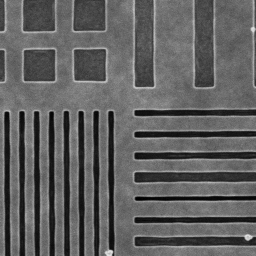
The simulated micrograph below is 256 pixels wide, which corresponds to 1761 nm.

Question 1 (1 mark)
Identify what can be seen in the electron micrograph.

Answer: groups of lines, slits or small figures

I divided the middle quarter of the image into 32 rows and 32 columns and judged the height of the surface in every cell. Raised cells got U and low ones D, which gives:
UUDDDDDDDDUUUUUUUDDDDDDUUUUUUUUU
UUDDDDDDDDUUUUUUUDDDDDDUUUUUUUUU
UUDDDDDDDDDUUUUUUUDDDDDUUUUUUUUU
UUDDDDDDDDDUUUUUUUDDDDDUUUUUUUUU
UUUUUUUUUDUUUUUUUUDDDDDUUUUUUUUU
UUUUUUUUUUUUUUUUUUDDDDUUUUUUUUUU
UUUUUUUUUUUUUUUUUUUUUUUUUUUUUUUU
UUUUUUUUUUUUUUUUUUUUUUUUUUUUUUUU
UUUUUUUUUUUUUUUUUUUUUUUUUUUUUUUU
UUUUUUUUUUUUUUUUUUUUUUUUUUUUUUUU
UUUUUUUUUUUUUUUUUUUUUUUUUUUUUUUU
UUUUUUUUUUUUUUUUUUDDDDDUUUDDDDDD
DUUDDUUDDUUDDUUUUUDDDDDDDDDDDDDD
DUUDDUUDDUUDDUUUUUUUUUUUUUUUUUUU
DUUDDUUDDUUDDUUUUUUUUUUUUUUUUUUU
DUUDDUUDDUUDDUUUUUUUUUUUUUUUUUUU
DUUDDUUDDUUDDUUUUUUUUUUUUUUUUUUU
DUUDDUUDDUUDDUUUUUDDDDDDDDDDDDDD
DUUDDUUDDUUDDUUUUUDDDDDDDUDDDDDD
DUUDDUUDDUUDDUUUUUUUUUUUUUUUUUUU
DUUDDUUDDUUDDUUUUUUUUUUUUUUUUUUU
DUUDDUUDDUUDDUUUUUUUUUUUUUUUUUUU
DUUDDUUDDUUDDUUUUUDDDDDDDDDDDDDD
DDUDDUUDDUUDDUUUUUDDDDDDDDDDDDDD
DDUUDUUDDUUDDUUUUUUUUUUUUUUUUUUU
DUUUDUUDDUUDDUUUUUUUUUUUUUUUUUUU
DUUUDUUDDUUDDUUUUUUUUUUUUUUUUUUU
DUUDDUUDDUUDDUUUUDDDDDDDDDDDDDDD
DUUDDUUDDUUDDUUUUDDDDDDDDDDDDDDD
DUUDDUUDDUUDDUUUUUDDDDDDDDDDDDDD
DDUDDUUDDUUDDUUUUUUUUUUUUUUUUUUU
DDUDDUUDDUUDDUUUUUUUUUUUUUUUUUUU